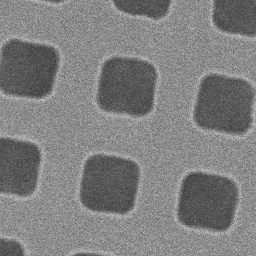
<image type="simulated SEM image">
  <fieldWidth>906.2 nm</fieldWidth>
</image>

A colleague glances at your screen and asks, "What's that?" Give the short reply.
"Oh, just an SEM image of holes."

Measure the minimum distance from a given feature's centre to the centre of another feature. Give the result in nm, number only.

350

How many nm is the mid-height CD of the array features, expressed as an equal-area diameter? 216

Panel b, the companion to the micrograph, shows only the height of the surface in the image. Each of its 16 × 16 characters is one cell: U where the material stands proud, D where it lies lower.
UUUUUUUDDDDUUDDD
UUUUUUUUUUUUUDDD
UUUUUUUUUUUUUUUU
DDDDUUUUUUUUUUUU
DDDDUUDDDDUUUUUU
DDDUUUDDDDUUDDDD
UUUUUUDDDDUUDDDD
UUUUUUUUUUUUDDDD
UUUUUUUUUUUUUUUU
DDUUUUUUUUUUUUUU
DDUUUDDDDUUUUUUU
DDUUUDDDDUUDDDDU
UUUUUDDDUUUDDDDU
UUUUUUUUUUUDDDDU
UUUUUUUUUUUUUUUU
DUUUUUUUUUUUUUUU